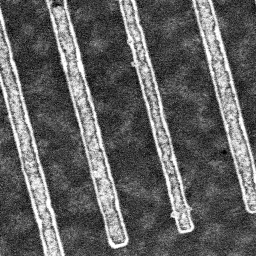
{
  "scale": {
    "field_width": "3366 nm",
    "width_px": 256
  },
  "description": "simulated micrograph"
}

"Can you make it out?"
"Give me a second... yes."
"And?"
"one or a few lines or trenches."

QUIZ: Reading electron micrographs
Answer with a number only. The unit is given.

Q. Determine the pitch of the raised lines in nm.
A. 903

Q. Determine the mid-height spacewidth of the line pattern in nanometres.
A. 696